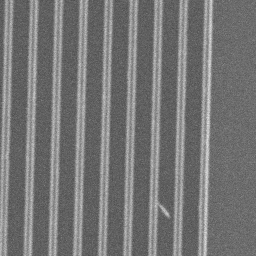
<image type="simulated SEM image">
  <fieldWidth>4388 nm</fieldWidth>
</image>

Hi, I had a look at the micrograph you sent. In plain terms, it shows parallel lines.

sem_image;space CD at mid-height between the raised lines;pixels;19.5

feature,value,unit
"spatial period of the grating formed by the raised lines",24.9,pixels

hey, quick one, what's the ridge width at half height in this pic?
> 94.2 nanometers